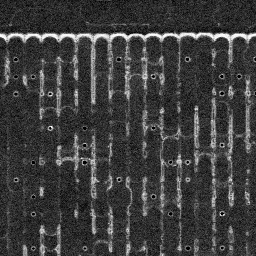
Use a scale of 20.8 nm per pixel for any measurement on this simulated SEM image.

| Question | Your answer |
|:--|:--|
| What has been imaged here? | wiring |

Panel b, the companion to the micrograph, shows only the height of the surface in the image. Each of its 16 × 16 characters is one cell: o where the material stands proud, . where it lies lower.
................
................
oooooooooooooooo
oooooooooooooooo
oooooooooooooooo
oooooooooooooooo
oooooooooooooooo
oooooooooooooooo
oooooooooooooooo
oooooooooooooooo
oooooooooooooooo
oooooooooooooooo
oooooooooooooooo
oooooooooooooooo
oooooooooooooooo
oooooooooooooooo